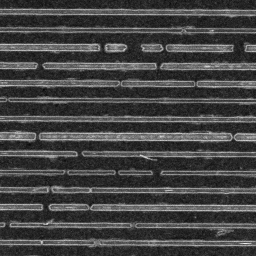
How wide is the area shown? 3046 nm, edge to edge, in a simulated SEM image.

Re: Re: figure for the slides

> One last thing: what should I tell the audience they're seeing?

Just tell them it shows parallel lines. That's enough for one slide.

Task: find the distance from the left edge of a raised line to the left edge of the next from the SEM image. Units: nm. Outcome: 211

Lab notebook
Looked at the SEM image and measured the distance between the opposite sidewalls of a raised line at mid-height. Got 162 nm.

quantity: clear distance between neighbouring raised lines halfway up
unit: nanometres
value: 46.1